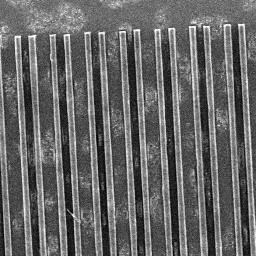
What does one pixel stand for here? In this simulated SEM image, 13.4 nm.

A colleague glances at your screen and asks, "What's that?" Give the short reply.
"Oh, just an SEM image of parallel lines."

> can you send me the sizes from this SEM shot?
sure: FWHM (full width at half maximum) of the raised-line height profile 83.7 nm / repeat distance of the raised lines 233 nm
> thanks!